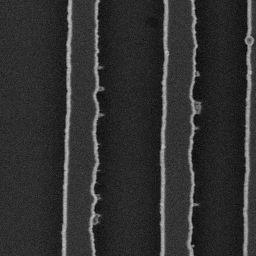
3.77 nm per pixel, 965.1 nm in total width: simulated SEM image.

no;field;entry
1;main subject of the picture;lines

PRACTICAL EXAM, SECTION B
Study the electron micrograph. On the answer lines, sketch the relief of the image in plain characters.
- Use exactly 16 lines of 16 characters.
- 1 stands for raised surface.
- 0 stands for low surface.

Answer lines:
0000110000110000
0000110000110000
0000110000110001
0000110000110001
0000110000110000
0000110000110001
0000110000110001
0000110000110001
0000110000110001
0000110000110001
0000110000110001
0000110000110001
0000110000110001
0000110000110001
0000110000110001
0000110000110001